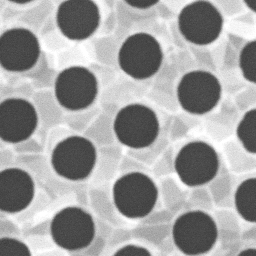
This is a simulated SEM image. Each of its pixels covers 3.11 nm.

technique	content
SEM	a regular array of holes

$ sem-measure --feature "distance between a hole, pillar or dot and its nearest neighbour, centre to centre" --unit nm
216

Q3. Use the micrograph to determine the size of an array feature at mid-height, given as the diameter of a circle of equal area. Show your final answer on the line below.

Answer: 144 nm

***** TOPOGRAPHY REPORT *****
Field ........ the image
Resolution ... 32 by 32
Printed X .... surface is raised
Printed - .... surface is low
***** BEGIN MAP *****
XX-XXXX-----XXXX---XXXX----XXXX-
XXXXXXX------XXXXXXXXX------XXXX
XXXXXXX------XXXXXXXXX------XXXX
X--XXXX-----XXXXXXXXXX------XXXX
-----XXX----XXXX---XXXX----XXXXX
-----XXXXXXXXXX-----XXXX--XXXXX-
-----XXXXXXXXXX-----XXXXXXXXXX--
-----XXXXXXXXXX-----XXXXXXXXXX--
----XXXX---XXXX-----XXXXXXXXXX--
XXXXXXX-----XXXX---XXXX----XXX--
XXXXXXX-----XXXXXXXXXX------XXXX
XXXXXXX-----XXXXXXXXXX------XXXX
---XXXX-----XXXXXXXXXX------XXXX
----XXXX---XXXX----XXXX----XXXXX
-----XXXXXXXXXX-----XXXX-XXXXX--
-----XXXXXXXXX------XXXXXXXXXX--
----XXXXXXXXXX------XXXXXXXXX---
---XXXXX---XXXX----XXXXX-XXXXX--
XXXXXXX-----XXXXX-XXXXX----XXX--
XXXXXX------XXXXXXXXXX-----XXXXX
XXXXXX------XXXXXXXXXX-----XXXXX
---XXXX-----XXXXX-XXXX-----XXXXX
----XXXXX--XXXX----XXXX----XXXX-
----XXXXXXXXXX------XXXXXXXXXX--
----XXXXXXXXXX------XXXXXXXXX---
----XXXXXXXXXX-----XXXXXXXXXX---
--XXXXX----XXXX----XXXX---XXXX--
XXXXXX------XXXXXXXXXX-----XXXX-
XXXXXX------XXXXXXXXXX-----XXXXX
XXXXXX------XXXXXXXXXX-----XXXXX
---XXXX----XXXXX-XXXXX-----XXXXX
----XXXXXXXXXX-----XXXX---XXXX--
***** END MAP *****